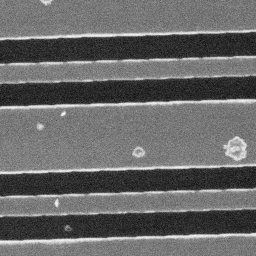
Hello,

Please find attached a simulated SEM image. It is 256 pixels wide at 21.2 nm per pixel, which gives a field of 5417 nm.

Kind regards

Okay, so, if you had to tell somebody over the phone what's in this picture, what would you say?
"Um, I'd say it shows lines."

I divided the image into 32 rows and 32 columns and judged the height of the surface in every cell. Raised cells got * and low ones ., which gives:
********************************
********************************
********************************
********************************
**************..................
................................
................................
...................*************
********************************
****************************....
................................
................................
................................
********************************
********************************
********************************
********************************
********************************
********************************
********************************
********************************
******..........................
................................
................................
.....***************************
********************************
****************................
................................
................................
.......................*********
********************************
********************************